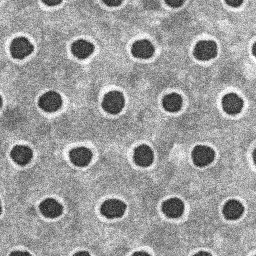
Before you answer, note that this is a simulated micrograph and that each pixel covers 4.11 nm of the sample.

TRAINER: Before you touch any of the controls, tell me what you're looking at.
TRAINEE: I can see a regular array of holes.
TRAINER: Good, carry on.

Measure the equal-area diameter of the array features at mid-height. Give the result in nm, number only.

106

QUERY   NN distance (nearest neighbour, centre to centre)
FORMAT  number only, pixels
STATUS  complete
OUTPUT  59.6